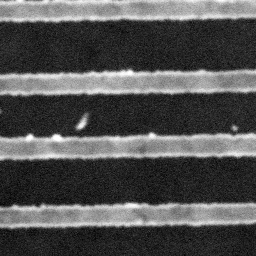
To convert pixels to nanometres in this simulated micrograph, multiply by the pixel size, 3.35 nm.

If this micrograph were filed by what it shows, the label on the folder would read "lines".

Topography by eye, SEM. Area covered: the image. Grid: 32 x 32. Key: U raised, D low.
UUUUUUUUUUUUUUUUUUUUUUUUUUUUUUUU
UUUUUUUUUUUUUUUUUUUUUUUUUUUUUUUU
DUUDDDUUDDDDDDDDDDDDDDDDDDDDDDDD
DDDDDDDDDDDDDDDDDDDDDDDDDDDDDDDD
DDDDDDDDDDDDDDDDDDDDDDDDDDDDDDDD
DDDDDDDDDDDDDDDDDDDDDDDDDDDDDDDD
DDDDDDDDDDDDDDDDDDDDDDDDDDDDDDDD
DDDDDDDDDDDDDDDDDDDDDDDDDDDDDDDD
DDDDDDDDDDDDDDDDDDDDDDDDDDDDDDDD
UUUUUUUUUUUUUUUUUUUUUUUUUUUUUUUU
UUUUUUUUUUUUUUUUUUUUUUUUUUUUUUUU
UUUUUUUUUUUUUUUUUUUUUUUDDUUDDDDD
DDDDDDDDDDDDDDDDDDDDDDDDDDDDDDDD
DDDDDDDDDDDDDDDDDDDDDDDDDDDDDDDD
DDDDDDDDDDDDDDDDDDDDDDDDDDDDDDDD
DDDDDDDDDDDDDDDDDDDDDDDDDDDDDDDD
DDDDDDDDDDDDDDDDDDDDDDDDDDDDDDDD
UUUUUUUUUUUUUUUUUUUUUUUUUUUUUUUU
UUUUUUUUUUUUUUUUUUUUUUUUUUUUUUUU
UUUUUUUUUUUUUUUUUUUUUDUDUUDUDDDD
DDDDDDDDDDDDDDDDDDDDDDDDDDDDDDDD
DDDDDDDDDDDDDDDDDDDDDDDDDDDDDDDD
DDDDDDDDDDDDDDDDDDDDDDDDDDDDDDDD
DDDDDDDDDDDDDDDDDDDDDDDDDDDDDDDD
DDDDDDDDDDDDDDDDDDDDDDDDDDDDDDDD
DDDDDDDDDDDDDDDDUDDDDDDDDDDDDDDU
UUUUUUUUUUUUUUUUUUUUUUUUUUUUUUUU
UUUUUUUUUUUUUUUUUUUUUUUUUUUUUUUU
DDDDDDDDDDDDDDDDDDDDDDDDDDDDDDDD
DDDDDDDDDDDDDDDDDDDDDDDDDDDDDDDD
DDDDDDDDDDDDDDDDDDDDDDDDDDDDDDDD
DDDDDDDDDDDDDDDDDDDDDDDDDDDDDDDD